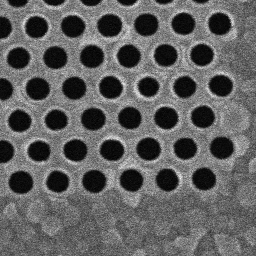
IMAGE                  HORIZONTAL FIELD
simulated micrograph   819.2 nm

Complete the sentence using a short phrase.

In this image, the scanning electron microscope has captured a regular array of holes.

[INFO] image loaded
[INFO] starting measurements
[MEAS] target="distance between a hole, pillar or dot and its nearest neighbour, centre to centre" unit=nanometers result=114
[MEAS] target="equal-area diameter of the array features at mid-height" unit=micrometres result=0.0735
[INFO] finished